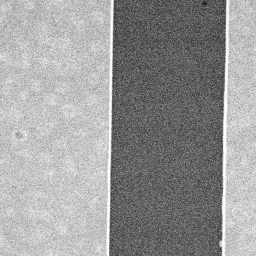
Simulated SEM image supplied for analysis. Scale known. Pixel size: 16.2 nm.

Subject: one or a few lines or trenches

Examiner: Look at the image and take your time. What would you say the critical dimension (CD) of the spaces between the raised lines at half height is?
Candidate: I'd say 1860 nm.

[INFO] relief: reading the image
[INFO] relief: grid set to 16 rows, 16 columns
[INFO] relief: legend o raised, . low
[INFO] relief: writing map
ooooooo.......oo
ooooooo.......oo
ooooooo.......oo
ooooooo.......oo
ooooooo.......oo
ooooooo.......oo
ooooooo.......oo
ooooooo.......oo
ooooooo.......oo
ooooooo.......oo
ooooooo.......oo
ooooooo.......oo
ooooooo.......oo
ooooooo.......oo
ooooooo.......oo
ooooooo.......oo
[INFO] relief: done